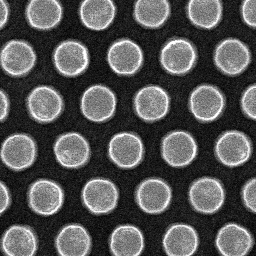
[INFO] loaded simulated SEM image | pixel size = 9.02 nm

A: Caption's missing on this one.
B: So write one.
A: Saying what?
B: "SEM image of a regular array of raised bodies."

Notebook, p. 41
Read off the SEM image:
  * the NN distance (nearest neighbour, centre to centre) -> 53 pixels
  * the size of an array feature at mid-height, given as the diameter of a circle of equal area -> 320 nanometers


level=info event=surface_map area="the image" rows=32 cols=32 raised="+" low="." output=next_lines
+...+++...++++...++++...++++..++
+..+++++..++++...++++...++++..++
+...+++...++++...++++...+++....+
.....+.....++...................
................................
.++.....++....+++....+++....++..
++++...++++...++++..++++...++++.
++++...++++...++++..++++...++++.
++++...++++...+++....+++...++++.
................................
................................
....+++....+++...++++...+++....+
+...++++..++++...++++...++++..++
+...++++..++++...++++...++++..++
+...+++....+++...+++....+++....+
................................
......................+.....++..
.+++...++++...++++..++++...++++.
++++...++++...++++..+++++..++++.
++++...++++...++++..++++...++++.
.+++....++.....++....+++....++..
................................
.....+.....++.....++.....++....+
+...++++...+++...++++...++++..++
+...++++..+++++..++++...++++..++
+...++++...++++..++++...++++...+
.....++....++.....++.....++.....
................................
.++.....++.....++....+++....++..
++++...++++...++++...++++..++++.
+++++..++++...++++..+++++..+++++
.+++...++++...++++...+++...++++.